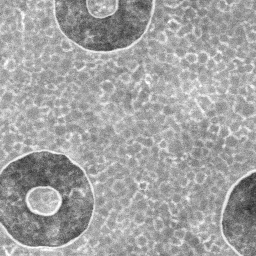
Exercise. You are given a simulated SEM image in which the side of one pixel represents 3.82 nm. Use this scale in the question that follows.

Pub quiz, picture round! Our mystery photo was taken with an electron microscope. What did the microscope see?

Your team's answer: ring-shaped grooves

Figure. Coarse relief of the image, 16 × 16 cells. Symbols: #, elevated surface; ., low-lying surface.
###..##...######
####.....#######
####.....#######
################
################
################
################
################
################
##.#############
.....###########
......#########.
..##..########..
......########..
.....#########..
###############.